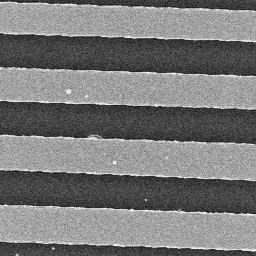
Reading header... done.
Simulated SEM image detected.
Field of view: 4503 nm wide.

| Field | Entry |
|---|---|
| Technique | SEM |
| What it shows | lines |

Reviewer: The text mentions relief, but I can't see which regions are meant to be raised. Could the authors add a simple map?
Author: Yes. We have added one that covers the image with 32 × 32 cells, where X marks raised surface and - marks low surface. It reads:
XXXXXX--------------------------
XXXXXXXXXXXXXXXXXXXXXXXXXXXXXXXX
XXXXXXXXXXXXXXXXXXXXXXXXXXXXXXXX
XXXXXXXXXXXXXXXXXXXXXXXXXXXXXXXX
------------XXXXXXXXXXXXXXXXXXXX
--------------------------------
--------------------------------
--------------------------------
X-------------------------------
XXXXXXXXXXXXXXXXXXXXXXXXXXXXXXX-
XXXXXXXXXXXXXXXXXXXXXXXXXXXXXXXX
XXXXXXXXXXXXXXXXXXXXXXXXXXXXXXXX
XXXXXXXXXXXXXXXXXXXXXXXXXXXXXXXX
-----------------------------XXX
--------------------------------
--------------------------------
--------------------------------
XXXXXXXXXXXXXXXX----------------
XXXXXXXXXXXXXXXXXXXXXXXXXXXXXXXX
XXXXXXXXXXXXXXXXXXXXXXXXXXXXXXXX
XXXXXXXXXXXXXXXXXXXXXXXXXXXXXXXX
--------XXXXXXXXXXXXXXXXXXXXXXXX
--------------------------------
--------------------------------
--------------------------------
--------------------------------
XXXXXXXXXXXXXXXXXXXXXXX---------
XXXXXXXXXXXXXXXXXXXXXXXXXXXXXXXX
XXXXXXXXXXXXXXXXXXXXXXXXXXXXXXXX
XXXXXXXXXXXXXXXXXXXXXXXXXXXXXXXX
-----------XXXXXXXXXXXXXXXXXXXXX
--------------------------------